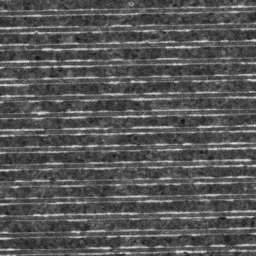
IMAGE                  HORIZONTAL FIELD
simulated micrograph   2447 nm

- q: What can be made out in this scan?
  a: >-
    parallel lines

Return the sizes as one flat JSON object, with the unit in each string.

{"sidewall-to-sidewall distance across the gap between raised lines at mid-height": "40.6 nanometers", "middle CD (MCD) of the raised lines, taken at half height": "122 nm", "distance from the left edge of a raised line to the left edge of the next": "163 nm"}